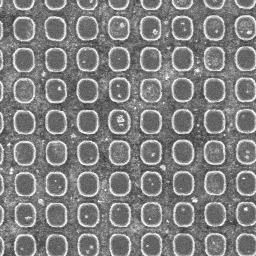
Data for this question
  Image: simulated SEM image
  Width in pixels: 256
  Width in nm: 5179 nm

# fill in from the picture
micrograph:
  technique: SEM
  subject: a regular array of raised bodies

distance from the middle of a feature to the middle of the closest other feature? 0.625 um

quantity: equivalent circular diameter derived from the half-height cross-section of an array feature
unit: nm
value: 463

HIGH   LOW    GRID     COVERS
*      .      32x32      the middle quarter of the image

....****....****...*****....****
.....**......**.....***......**.
................................
................................
....****....****....****....****
...*****...*****...*****...*****
...*****...*****...*****...*****
...*****...*****...*****...*****
....****....****....****....****
......*.........................
................................
................................
....****...*****....****....****
*...****...*****...*****...*****
*...****....****...*****...*****
*...****....****...*****...*****
....****....****....****....****
................................
................................
.............**.....***.....***.
....****....****...*****...*****
*..*****....****...*****...*****
*..*****....****...*****...*****
*...****....****...*****...*****
....****....****....****....****
................................
................................
....***.....***.....***.....****
....****....****...*****...*****
....****....****...*****...*****
....****....****...*****...*****
....****....****....****....****